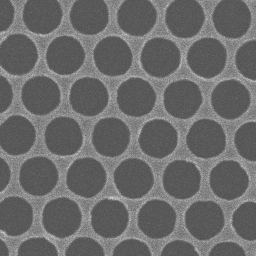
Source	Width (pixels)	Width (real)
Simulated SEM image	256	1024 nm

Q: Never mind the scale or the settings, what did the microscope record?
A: a regular array of holes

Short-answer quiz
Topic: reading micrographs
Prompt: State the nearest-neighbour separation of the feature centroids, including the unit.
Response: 186 nm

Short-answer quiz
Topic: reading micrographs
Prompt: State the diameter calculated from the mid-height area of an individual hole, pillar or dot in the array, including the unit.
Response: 158 nanometers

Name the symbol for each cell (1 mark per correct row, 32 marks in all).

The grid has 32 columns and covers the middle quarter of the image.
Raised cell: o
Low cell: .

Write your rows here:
....oooo.........oo..........oo.
...ooooo........oooo........oooo
..oooooooo.....oooooo......ooooo
oooo...ooooooooo...ooooooooooooo
ooo......oooooo......oooooo.....
oo........oooo........oooo......
oo.........oo..........oo.......
o..........oo..........oo.......
o..........oo..........oo.......
oo.........oo..........oo.......
oo.........ooo.........oo.......
ooo.......oooo........oooo......
oooo.....oooooo......ooooo......
..oooooooo...ooooooooooooooo...o
...oooooo......oooooo.....oooooo
....oooo........oooo.......ooooo
....ooo.........ooo.........ooo.
.....oo..........oo..........oo.
.....oo..........oo..........o..
.....oo.........ooo.........oo..
....ooo.........ooo.........ooo.
....oooo.......oooo.........ooo.
..ooooooo.....oooooo.......ooooo
ooooo..oooooooooooooooo..ooooooo
oo.......ooooo......ooooooo....o
o.........ooo........ooooo......
o.........ooo.........ooo.......
o.........oo..........ooo.......
...........o..........ooo.......
...........oo..........oo.......
o.........ooo.........ooo.......
oo........oooo........ooo.......